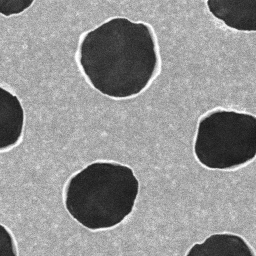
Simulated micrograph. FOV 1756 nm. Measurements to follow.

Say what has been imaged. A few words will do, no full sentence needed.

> holes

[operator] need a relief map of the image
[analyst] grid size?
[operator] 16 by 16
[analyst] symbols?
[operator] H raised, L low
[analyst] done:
LLHHHHHHHHHHHLLL
HHHHHHLLLHHHHHLL
HHHHHLLLLLHHHHHH
HHHHHLLLLLHHHHHH
HHHHHLLLLLHHHHHH
HHHHHHLLLHHHHHHH
LHHHHHHHHHHHHHHH
LHHHHHHHHHHHHLLL
LHHHHHHHHHHHLLLL
HHHHHHHHHHHHLLLL
HHHHHLLLHHHHHLHH
HHHHLLLLLHHHHHHH
HHHHLLLLHHHHHHHH
HHHHHLLLHHHHHHHH
HHHHHHHHHHHHHHHH
LHHHHHHHHHHHLLLL